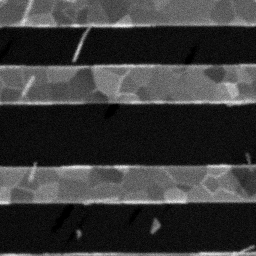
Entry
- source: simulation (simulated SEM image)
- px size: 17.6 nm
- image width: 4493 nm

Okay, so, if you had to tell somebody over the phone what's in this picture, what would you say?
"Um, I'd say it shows lines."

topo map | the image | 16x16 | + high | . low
++++++++++++++++
++++++++++++++++
................
................
++++++++++++++++
++++++++++++++++
................
................
................
................
..+.++++++++++++
++++++++++++++++
++++++++++++++++
................
................
................